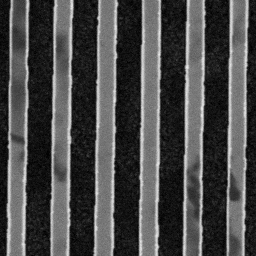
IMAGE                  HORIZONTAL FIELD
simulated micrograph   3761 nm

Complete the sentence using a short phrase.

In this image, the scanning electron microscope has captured lines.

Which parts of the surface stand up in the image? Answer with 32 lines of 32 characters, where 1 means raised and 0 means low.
01100001100011100011000111000110
01100001100011100011000111000110
01100001100011000011000111000110
01100001100011100011000111000110
01100001100011000011000111000110
01100001100011000011000111000110
01100001100011000011000111000110
01100001100011000011000111000110
01100001100011000011000111000110
01100001100011000011000111000110
01100001100011000011000110000110
01100001100011000011000110000110
01100001100011000011000110000110
01100001100011000011000110000110
01100001100011000011000110000110
01100001100011000011000110000110
01100001100011000011000110000110
01100001100011000011000110000110
01100001100011000011000110000110
01100001100011000011000110000110
01100001100011000011000110000110
01100001100011000011000110000110
01100001100011000011000110000110
01100001100011000011000110000110
01100001100011000011000110000100
01100001100011000011000110000100
01100011100011000011000110001100
01100011100011000111000110001100
01100011100011000111000110001100
01100011100011000111000110001100
01100011100011000111000110001100
01100011000011000111000110001100